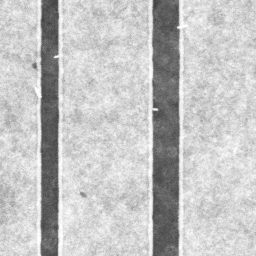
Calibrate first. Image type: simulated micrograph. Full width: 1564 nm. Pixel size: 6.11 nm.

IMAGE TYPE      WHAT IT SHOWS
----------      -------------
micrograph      one or a few lines or trenches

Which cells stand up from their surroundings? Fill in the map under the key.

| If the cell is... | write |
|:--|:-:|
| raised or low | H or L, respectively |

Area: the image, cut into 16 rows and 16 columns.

HHLLHHHHHLLHHHHH
HHLLHHHHHLLHHHHH
HHLLHHHHHLLHHHHH
HHLLHHHHHLLHHHHH
HHLLHHHHHLLHHHHH
HHLLHHHHHLLHHHHH
HHLLHHHHHLLHHHHH
HHLLHHHHHLLHHHHH
HHLLHHHHHLLHHHHH
HHLLHHHHHLLHHHHH
HHLLHHHHHLLHHHHH
HHLLHHHHHLLHHHHH
HHLLHHHHHLLHHHHH
HHLLHHHHHLLHHHHH
HHLLHHHHHLLHHHHH
HHLLHHHHHLLHHHHH